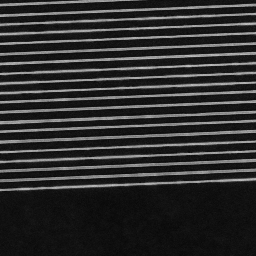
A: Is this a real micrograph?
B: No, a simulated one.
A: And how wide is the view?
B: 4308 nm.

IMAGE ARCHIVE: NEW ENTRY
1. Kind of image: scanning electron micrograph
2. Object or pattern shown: parallel lines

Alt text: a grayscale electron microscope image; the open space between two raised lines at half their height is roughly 0.13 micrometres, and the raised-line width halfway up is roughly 33.6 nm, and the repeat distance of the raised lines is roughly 163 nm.